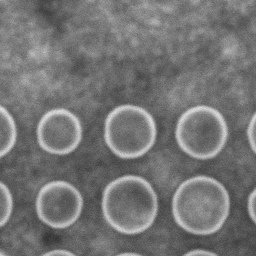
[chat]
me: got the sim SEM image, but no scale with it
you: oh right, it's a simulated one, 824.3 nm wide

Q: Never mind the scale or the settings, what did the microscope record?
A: raised bodies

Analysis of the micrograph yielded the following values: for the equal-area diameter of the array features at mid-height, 0.163 µm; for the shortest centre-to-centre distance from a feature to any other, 228 nanometers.